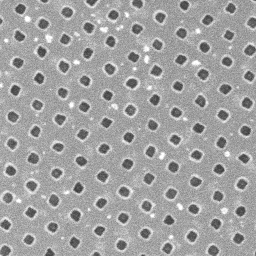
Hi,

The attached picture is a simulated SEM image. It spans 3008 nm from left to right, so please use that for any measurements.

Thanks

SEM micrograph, a regular array of holes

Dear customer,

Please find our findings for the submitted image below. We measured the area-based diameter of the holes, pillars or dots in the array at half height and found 128 nm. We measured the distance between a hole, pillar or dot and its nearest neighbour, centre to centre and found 306 nanometres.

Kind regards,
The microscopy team